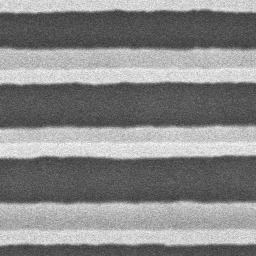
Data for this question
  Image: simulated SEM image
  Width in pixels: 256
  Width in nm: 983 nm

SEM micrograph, lines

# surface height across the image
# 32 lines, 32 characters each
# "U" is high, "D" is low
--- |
UUUUUUUUUUUUUUUUUUUUUUUUUUUUUUUU
DDUUUDDDDDDDDDDDDDDDDDDDDDDDDDDD
DDDDDDDDDDDDDDDDDDDDDDDDDDDDDDDD
DDDDDDDDDDDDDDDDDDDDDDDDDDDDDDDD
DDDDDDDDDDDDDDDDDDDDDDDDDDDDDDDD
DDDDDDDDDDDDDDDDDDDDDDDDDDDDDDDD
UUUUUUUUUUUUUUUUUUUUUUDUUUUUUUUU
UUUUUUUUUUUUUUUUUUUUUUUUUUUUUUUU
UUUUUUUUUUUUUUUUUUUUUUUUUUUUUUUU
UUUUUUUUUUUUUUUUUUUUUUUUUUUUUUUU
DDDDDDDDDDDDDDDDDDDDDDDDDDDDDDDD
DDDDDDDDDDDDDDDDDDDDDDDDDDDDDDDD
DDDDDDDDDDDDDDDDDDDDDDDDDDDDDDDD
DDDDDDDDDDDDDDDDDDDDDDDDDDDDDDDD
DDDDDDDDDDDDDDDDDDDDDDDDDDDDDDDD
DDDDDDDDDDDDDDDDDDDDDDDDDDDDDDDD
UUUUUUUUUUUUUUUUUUUUUUUUUUUUUUUU
UUUUUUUUUUUUUUUUUUUUUUUUUUUUUUUU
UUUUUUUUUUUUUUUUUUUUUUUUUUUUUUUU
UUUUUDDUUUDDUUUUUUUUUUDUDDDDDDDD
DDDDDDDDDDDDDDDDDDDDDDDDDDDDDDDD
DDDDDDDDDDDDDDDDDDDDDDDDDDDDDDDD
DDDDDDDDDDDDDDDDDDDDDDDDDDDDDDDD
DDDDDDDDDDDDDDDDDDDDDDDDDDDDDDDD
DDDDDDDDDDDDDDDDDDDDDDDDDDDDDDDD
DDDDDDDDDDDDDDDDDDUUUUUUUDDUDUUU
UUUUUUUUUUUUUUUUUUUUUUUUUUUUUUUU
UUUUUUUUUUUUUUUUUUUUUUUUUUUUUUUU
UUUUUUUUUUUUUUUUUUUUUUUUUUUUUUUU
UUUUUUUUUUUUUUUUUUUUUUUUUUUUUUUU
UDDDDDDDDDDDDDDDDDDDDUUUDDDDDDDD
DDDDDDDDDDDDDDDDDDDDDDDDDDDDDDDD